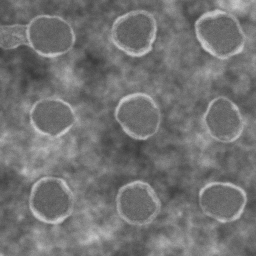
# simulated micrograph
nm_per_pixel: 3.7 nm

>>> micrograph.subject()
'a regular array of raised bodies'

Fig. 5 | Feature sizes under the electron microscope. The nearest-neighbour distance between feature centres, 0.309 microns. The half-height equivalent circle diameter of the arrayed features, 161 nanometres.